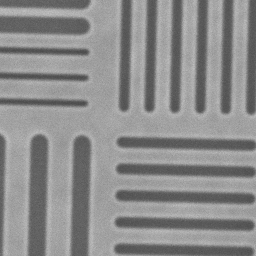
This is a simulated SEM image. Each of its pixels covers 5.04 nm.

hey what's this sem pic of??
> groups of lines, slits or small figures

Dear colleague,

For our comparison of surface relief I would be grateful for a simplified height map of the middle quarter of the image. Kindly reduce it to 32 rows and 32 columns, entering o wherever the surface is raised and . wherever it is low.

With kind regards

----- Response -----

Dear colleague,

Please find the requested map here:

oooooooooooooo...ooo...ooo....oo
oooooooooooooo...ooo...ooo...ooo
.....ooooooooo...ooo...ooo...ooo
......oooooooo...ooo...ooo...ooo
oooooooooooooo...ooo...ooo...ooo
oooooooooooooo...ooo...ooo...ooo
oooooooooooooo...ooo...ooo...ooo
oooooooooooooo...ooo...ooo...ooo
oooooooooooooo..oooo...ooo...ooo
......oooooooo..oooo...ooo...ooo
......oooooooo..oooo...ooo...ooo
oooooooooooooo..oooo...ooo...ooo
oooooooooooooooooooooooooooooooo
oooooooooooooooooooooooooooooooo
oooooooooooooooooooooooooooooooo
oooooooooooooooooooooooooooooooo
oooooooooooooooooooooooooooooooo
oooooooooooooooooooooooooooooooo
ooo...oooooooo..................
oo.....oooooo...................
oo.....ooooooo..................
oo.....ooooooooooooooooooooooo..
oo.....ooooooooooooooooooooooooo
oo.....ooooooooooooooooooooooooo
oo.....ooooooooooooooooooooooooo
oo.....oooooo...................
oo.....oooooo...................
oo.....ooooooo..................
oo.....ooooooooooooooooooooooooo
oo.....ooooooooooooooooooooooooo
oo.....ooooooooooooooooooooooooo
oo.....ooooooo.....ooooooooooooo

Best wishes